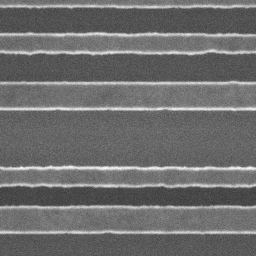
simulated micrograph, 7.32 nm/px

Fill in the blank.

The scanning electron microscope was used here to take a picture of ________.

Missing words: lines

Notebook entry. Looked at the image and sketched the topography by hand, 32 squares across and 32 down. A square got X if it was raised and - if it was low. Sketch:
XXXXXXXXXXXXXXXXXXXXXXXXXXXXXXXX
--------------------------------
--------------------------------
--------------------------------
XXXXXXXXXXXXXXXXXXXXXXXXXXXXXXXX
XXXXXXXXXXXXXXXXXXXXXXXXXXXXXXXX
XXXXXXXXXXXXXXXXXXXXXXXXXX-XXXXX
--------------------------------
--------------------------------
--------------------------------
XXXXXXXXXXXXXXXXXXXXXXXXXXXXXXXX
XXXXXXXXXXXXXXXXXXXXXXXXXXXXXXXX
XXXXXXXXXXXXXXXXXXXXXXXXXXXXXXXX
XXXXXXXXXXXXXXXXXXXXXXXXXXXXXXXX
--------------------------------
--------------------------------
--------------------------------
--------------------------------
--------------------------------
--------------------------------
--------------------------------
XXXXXXXXXXXXXXXXXXXXXXXXXXXXXXXX
XXXXXXXXXXXXXXXXXXXXXXXXXXXXXXXX
--------------------------------
--------------------------------
--------------------------------
XXXXXXXXXXXXXXXXXXXXXXXXXXXXXXXX
XXXXXXXXXXXXXXXXXXXXXXXXXXXXXXXX
XXXXXXXXXXXXXXXXXXXXXXXXXXXXXXXX
--------------------------------
--------------------------------
--------------------------------